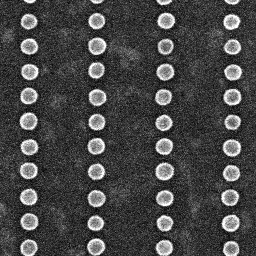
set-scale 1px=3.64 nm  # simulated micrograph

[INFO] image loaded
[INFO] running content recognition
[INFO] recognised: a regular array of raised bodies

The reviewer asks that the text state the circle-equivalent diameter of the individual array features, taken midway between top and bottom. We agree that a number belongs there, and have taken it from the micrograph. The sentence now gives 57.4 nanometres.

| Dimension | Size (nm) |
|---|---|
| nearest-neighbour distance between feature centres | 90.8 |